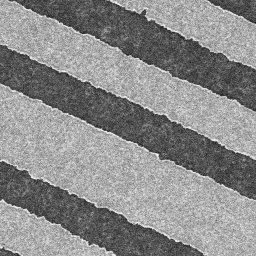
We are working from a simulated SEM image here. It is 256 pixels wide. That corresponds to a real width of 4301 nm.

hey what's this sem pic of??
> one or a few lines or trenches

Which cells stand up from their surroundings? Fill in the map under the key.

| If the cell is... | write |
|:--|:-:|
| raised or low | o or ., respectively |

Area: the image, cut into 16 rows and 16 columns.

oo......oooooo..
oooo......oooooo
oooooo......oooo
..oooooo......oo
....oooooo......
o.....ooooooo...
ooo......oooooo.
ooooo......ooooo
ooooooo......ooo
ooooooooo......o
.ooooooooooo....
...ooooooooooo..
.....ooooooooooo
oo......oooooooo
oooo......oooooo
oooooo......oooo